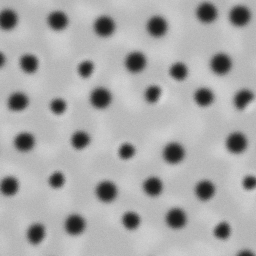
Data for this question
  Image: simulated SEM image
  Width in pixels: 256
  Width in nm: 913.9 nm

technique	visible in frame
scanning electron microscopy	a regular array of holes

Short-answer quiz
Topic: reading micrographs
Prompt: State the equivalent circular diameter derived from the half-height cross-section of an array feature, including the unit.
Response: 0.0681 um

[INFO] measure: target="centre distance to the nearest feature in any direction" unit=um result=0.141